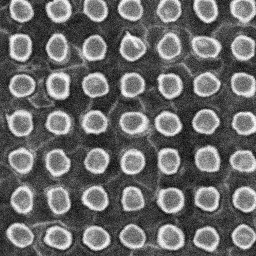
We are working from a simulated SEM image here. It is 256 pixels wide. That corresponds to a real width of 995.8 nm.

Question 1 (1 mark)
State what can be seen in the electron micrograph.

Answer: a regular array of raised bodies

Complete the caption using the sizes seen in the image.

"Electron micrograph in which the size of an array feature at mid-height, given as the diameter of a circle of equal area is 92.5 nanometres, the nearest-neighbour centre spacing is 0.142 micrometres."